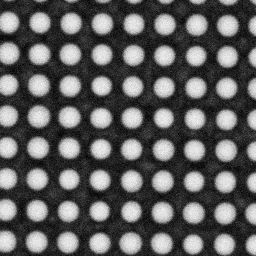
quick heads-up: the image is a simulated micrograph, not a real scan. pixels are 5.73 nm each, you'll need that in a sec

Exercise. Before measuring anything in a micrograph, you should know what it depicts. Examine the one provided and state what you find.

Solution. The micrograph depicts an array of small figures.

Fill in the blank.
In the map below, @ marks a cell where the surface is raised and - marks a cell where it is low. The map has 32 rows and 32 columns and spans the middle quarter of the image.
--------------------------------
--------------------------------
--------------------------------
@@@-----@@@-----@@------@@------
@@@@---@@@@@---@@@@----@@@@----@
@@@@---@@@@@---@@@@@---@@@@----@
@@@@---@@@@@---@@@@@---@@@@----@
@@@-----@@@-----@@@----@@@@----@
--------------------------------
--------------------------------
--------------------------------
@@@-----@@@-----@@@-----@@------
@@@@---@@@@@---@@@@----@@@@----@
@@@@---@@@@@---@@@@@---@@@@---@@
@@@@---@@@@@---@@@@----@@@@---@@
@@@-----@@@-----@@@-----@@-----@
--------------------------------
--------------------------------
--------------------------------
@@@-----@@@----@@@@----@@@-----@
@@@@---@@@@@---@@@@---@@@@@---@@
@@@@---@@@@@--@@@@@---@@@@@---@@
@@@----@@@@----@@@@----@@@@---@@
-@------@@-----@@@-----@@@@----@
--------------------------------
--------------------------------
-@------------------------------
@@@----@@@@----@@@@----@@@@----@
@@@@---@@@@----@@@@---@@@@@---@@
@@@@---@@@@---@@@@@---@@@@@---@@
@@@----@@@@----@@@@---@@@@@---@@
---------------@@@-----@@@-----@